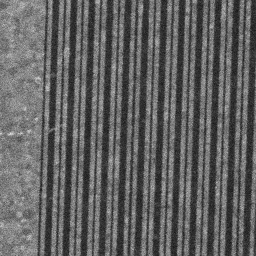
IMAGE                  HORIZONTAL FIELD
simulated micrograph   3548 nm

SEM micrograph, parallel lines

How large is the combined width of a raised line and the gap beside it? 125 nanometers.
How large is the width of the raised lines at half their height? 3.74 px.